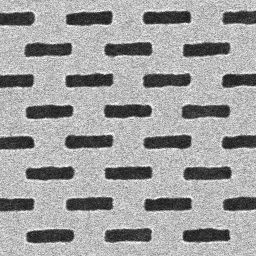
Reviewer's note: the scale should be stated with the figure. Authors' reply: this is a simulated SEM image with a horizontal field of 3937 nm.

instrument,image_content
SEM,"a regular array of holes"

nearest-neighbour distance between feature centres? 0.763 um